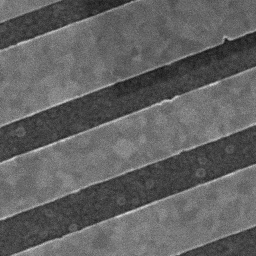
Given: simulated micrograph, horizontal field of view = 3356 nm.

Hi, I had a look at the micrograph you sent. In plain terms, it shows one or a few lines or trenches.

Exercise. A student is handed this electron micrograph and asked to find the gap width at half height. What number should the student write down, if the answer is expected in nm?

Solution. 453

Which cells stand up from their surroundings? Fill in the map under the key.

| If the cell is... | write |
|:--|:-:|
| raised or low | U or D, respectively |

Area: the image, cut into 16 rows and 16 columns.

UUUDDDDUUUUUUUUU
DDDDUUUUUUUUUUUU
DDUUUUUUUUUUUUDD
UUUUUUUUUUUUDDDD
UUUUUUUUUDDDDDDU
UUUUUUDDDDDDDUUU
UUUUDDDDDDUUUUUU
UDDDDDDUUUUUUUUU
DDDDDUUUUUUUUUDD
DDUUUUUUUUUDDDDD
UUUUUUUUUDDDDDDU
UUUUUUDDDDDDDUUU
UUUDDDDDDDUUUUUU
UDDDDDDUUUUUUUUU
DDDDUUUUUUUUUUUD
DDUUUUUUUUUUDDDD